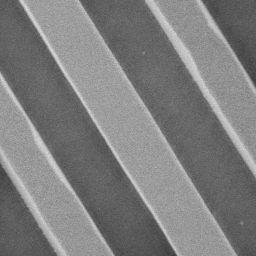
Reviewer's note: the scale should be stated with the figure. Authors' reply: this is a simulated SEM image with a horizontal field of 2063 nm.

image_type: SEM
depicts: lines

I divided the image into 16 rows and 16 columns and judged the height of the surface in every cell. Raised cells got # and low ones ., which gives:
.####.....###...
..####....###...
...###.....###..
...####.....###.
....####....###.
#....###.....###
#....####....###
##....####....##
##....####.....#
###....####....#
####....###.....
.###....####....
..###....####...
..####....###...
...###....####..
....###....####.